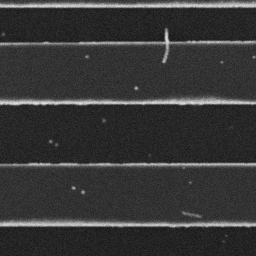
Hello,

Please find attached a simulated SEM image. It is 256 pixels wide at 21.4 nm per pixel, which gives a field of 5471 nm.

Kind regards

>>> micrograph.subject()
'lines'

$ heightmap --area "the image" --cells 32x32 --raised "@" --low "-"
@@@@@@@@@@@@@@@@@@@@@@@@@@@@@@@@
--------------------------------
--------------------------------
--------------------------------
--------------------------------
@@@@@@@@@@@@@@@@@@@@@@@@@@@@@@@@
@@@@@@@@@@@@@@@@@@@@@@@@@@@@@@@@
@@@@@@@@@@@@@@@@@@@@@@@@@@@@@@@@
@@@@@@@@@@@@@@@@@@@@@@@@@@@@@@@@
@@@@@@@@@@@@@@@@@@@@@@@@@@@@@@@@
@@@@@@@@@@@@@@@@@@@@@@@@@@@@@@@@
@@@@@@@@@@@@@@@@@@@@@@@@@@@@@@@@
@@@@@@@@@@@@@@@@@@@@@@@@@@@@@@@@
--------------------------------
--------------------------------
--------------------------------
--------------------------------
--------------------------------
--------------------------------
--------------------------------
---@@@@@@@-@@@-@@@@@@@@@@@@@@@@@
@@@@@@@@@@@@@@@@@@@@@@@@@@@@@@@@
@@@@@@@@@@@@@@@@@@@@@@@@@@@@@@@@
@@@@@@@@@@@@@@@@@@@@@@@@@@@@@@@@
@@@@@@@@@@@@@@@@@@@@@@@@@@@@@@@@
@@@@@@@@@@@@@@@@@@@@@@@@@@@@@@@@
@@@@@@@@@@@@@@@@@@@@@@@@@@@@@@@@
@@@@@@@@@@@@@@@@@@@@@@@@@@@@@@@@
--------------------------------
--------------------------------
--------------------------------
--------------------------------